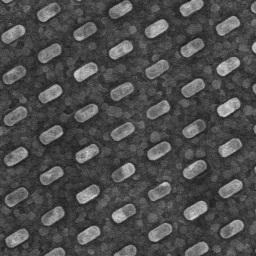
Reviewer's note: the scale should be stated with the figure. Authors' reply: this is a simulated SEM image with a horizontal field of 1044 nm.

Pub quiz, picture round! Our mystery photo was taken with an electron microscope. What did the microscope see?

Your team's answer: a regular array of raised bodies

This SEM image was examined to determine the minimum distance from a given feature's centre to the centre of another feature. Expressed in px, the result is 40.5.